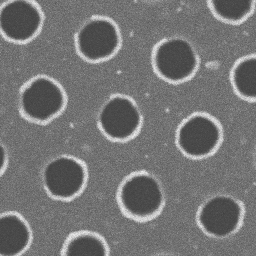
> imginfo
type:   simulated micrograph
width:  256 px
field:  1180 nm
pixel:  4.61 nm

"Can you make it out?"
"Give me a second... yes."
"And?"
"a regular array of holes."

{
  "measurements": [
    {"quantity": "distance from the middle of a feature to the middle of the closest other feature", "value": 0.368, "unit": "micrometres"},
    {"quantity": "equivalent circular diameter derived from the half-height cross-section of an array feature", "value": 37.5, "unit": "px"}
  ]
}